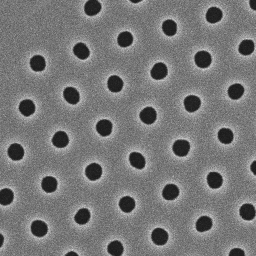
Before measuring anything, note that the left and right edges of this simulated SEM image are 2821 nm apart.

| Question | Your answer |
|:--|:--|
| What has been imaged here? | a regular array of holes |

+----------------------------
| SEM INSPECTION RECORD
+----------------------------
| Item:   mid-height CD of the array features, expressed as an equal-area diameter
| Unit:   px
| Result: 17.5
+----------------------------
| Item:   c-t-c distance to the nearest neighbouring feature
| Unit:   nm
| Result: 498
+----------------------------